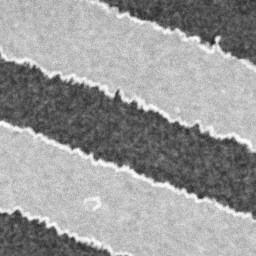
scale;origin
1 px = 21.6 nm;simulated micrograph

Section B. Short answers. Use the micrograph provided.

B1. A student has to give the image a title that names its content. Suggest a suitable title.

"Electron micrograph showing one or a few lines or trenches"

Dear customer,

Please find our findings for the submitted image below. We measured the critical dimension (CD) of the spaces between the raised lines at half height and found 1.45 um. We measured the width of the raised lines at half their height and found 1670 nm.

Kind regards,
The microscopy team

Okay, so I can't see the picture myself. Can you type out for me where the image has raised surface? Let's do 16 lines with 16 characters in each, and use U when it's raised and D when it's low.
UUUUUUUDDDDDDDDD
UUUUUUUUUDDDDDDD
UUUUUUUUUUUUDDDD
UUUUUUUUUUUUUUDD
DDDUUUUUUUUUUUUU
DDDDDDUUUUUUUUUU
DDDDDDDDDUUUUUUU
DDDDDDDDDDDUUUUU
UUDDDDDDDDDDDDUU
UUUUUDDDDDDDDDDD
UUUUUUUDDDDDDDDD
UUUUUUUUUUDDDDDD
UUUUUUUUUUUUUDDD
DDUUUUUUUUUUUUUD
DDDDUUUUUUUUUUUU
DDDDDDDUUUUUUUUU